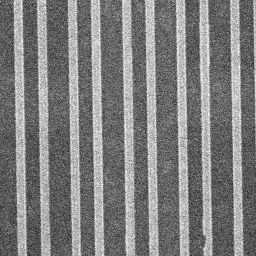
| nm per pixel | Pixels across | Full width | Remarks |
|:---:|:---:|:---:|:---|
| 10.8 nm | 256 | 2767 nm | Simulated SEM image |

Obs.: parallel lines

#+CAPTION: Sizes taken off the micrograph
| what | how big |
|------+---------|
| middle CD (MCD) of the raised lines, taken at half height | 82.4 nanometres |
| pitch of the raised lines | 292 nanometres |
